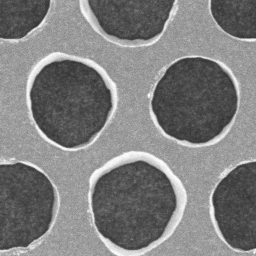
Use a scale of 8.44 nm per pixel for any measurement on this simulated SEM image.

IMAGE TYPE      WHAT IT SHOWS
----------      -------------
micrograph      holes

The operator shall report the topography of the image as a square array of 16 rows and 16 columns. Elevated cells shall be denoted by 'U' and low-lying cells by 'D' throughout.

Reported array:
DDDUUUDDDDDUUDDD
DDUUUUDDDDUUUUDD
UUUUUUUDDDUUUUUU
UUUUUUUUUUUUUUUU
UUDDDDUUUUDDDDUU
UUDDDDDUUUDDDDDU
UUDDDDDUUUDDDDDU
UUDDDDDUUUDDDDUU
UUUDDDUUUUUDDDUU
UUUUUUUUUUUUUUUU
DDUUUUUDDDUUUUUD
DDDUUUDDDDDUUUDD
DDDDUUDDDDDUUDDD
DDDUUUDDDDDUUDDD
DDDUUUDDDDUUUUDD
DUUUUUUUDUUUUUUD